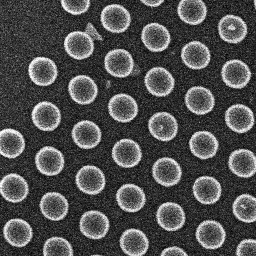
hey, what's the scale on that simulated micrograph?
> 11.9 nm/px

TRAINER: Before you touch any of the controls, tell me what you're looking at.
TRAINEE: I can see a regular array of raised bodies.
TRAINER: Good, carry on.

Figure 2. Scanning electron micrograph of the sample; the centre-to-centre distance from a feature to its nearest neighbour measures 523 nm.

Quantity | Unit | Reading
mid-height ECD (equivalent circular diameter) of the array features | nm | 317